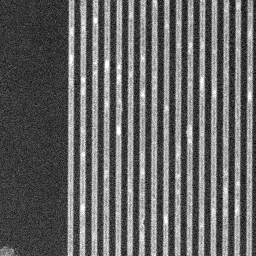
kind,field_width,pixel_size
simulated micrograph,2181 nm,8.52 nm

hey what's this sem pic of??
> parallel lines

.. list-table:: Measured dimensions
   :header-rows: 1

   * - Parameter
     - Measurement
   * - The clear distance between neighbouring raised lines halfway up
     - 0.0661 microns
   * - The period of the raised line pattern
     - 102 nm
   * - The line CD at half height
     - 37.3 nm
